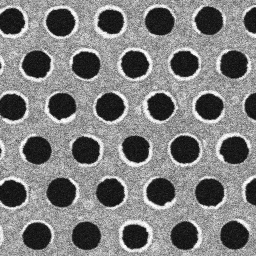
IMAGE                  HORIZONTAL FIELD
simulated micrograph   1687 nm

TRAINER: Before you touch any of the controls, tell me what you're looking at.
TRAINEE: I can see a regular array of holes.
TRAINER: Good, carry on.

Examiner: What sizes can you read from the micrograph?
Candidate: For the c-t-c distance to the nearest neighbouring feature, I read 320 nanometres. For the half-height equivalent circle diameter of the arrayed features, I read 0.188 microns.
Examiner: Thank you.